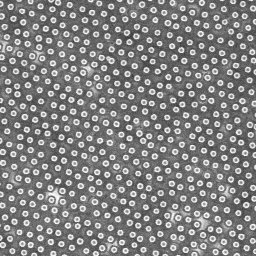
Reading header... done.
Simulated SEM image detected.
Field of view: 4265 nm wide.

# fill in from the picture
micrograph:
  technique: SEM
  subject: a regular array of raised bodies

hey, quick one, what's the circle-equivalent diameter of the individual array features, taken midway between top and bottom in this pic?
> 86.2 nm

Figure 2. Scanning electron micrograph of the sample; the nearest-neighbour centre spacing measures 166 nanometres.